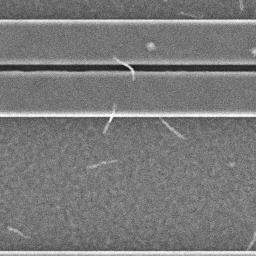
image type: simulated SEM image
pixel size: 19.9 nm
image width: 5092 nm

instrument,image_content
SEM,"lines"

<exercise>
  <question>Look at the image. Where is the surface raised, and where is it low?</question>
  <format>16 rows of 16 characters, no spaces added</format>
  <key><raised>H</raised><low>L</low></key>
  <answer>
LLLLLLLLLLLLLLLL
HHHHHHHHHHHHHHHH
HHHHHHHHHHHHHHHH
HHHHHHHHHHHHHHHH
HHHHHHHHHHHHHHHH
HHHHHHHHHHHHHHHH
HHHHHHHHHHHHHHHH
LLLLLLLLLLLLLLLL
LLLLLLLLLLLLLLLL
LLLLLLLLLLLLLLLL
LLLLLLLLLLLLLLLL
LLLLLLLLLLLLLLLL
LLLLLLLLLLLLLLLL
LLLLLLLLLLLLLLLL
LLLLLLLLLLLLLLLL
LLLLLLLLLLLLLLLL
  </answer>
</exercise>